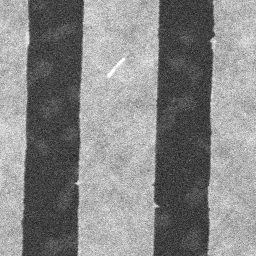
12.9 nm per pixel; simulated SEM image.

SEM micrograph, one or a few lines or trenches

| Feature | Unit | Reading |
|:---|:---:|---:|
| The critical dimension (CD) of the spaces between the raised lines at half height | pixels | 54.6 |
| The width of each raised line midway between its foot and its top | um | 0.974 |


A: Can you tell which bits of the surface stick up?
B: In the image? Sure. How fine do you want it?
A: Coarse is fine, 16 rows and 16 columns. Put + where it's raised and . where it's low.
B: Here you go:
++...+++++...+++
++...+++++...+++
++...+++++...+++
++...+++++...+++
++...+++++...+++
++...+++++...+++
++...+++++...+++
++...+++++...+++
++...+++++...+++
++...+++++...+++
++...+++++...+++
+....+++++...+++
+....+++++...+++
+....+++++...+++
+....+++++...+++
+....+++++...+++